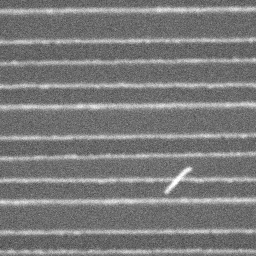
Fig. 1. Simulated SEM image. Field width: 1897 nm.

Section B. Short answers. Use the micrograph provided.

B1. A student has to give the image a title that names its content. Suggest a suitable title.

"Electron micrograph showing lines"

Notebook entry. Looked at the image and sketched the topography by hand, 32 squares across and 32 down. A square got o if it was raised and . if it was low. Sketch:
................................
oooooooooooooooooooooooooooooooo
oooooooooooooooooooooooooooooooo
oooooooooooooooooooooooooooooooo
oooooooooooooooooooooooooooooooo
................................
................................
..........................o..o.o
oooooooooooooooooooooooooooooooo
oooooooooooooooooooooooooooooooo
oooooooooooooooooooooooooooooooo
................................
................................
oooooooooooooooooooooooooooooooo
oooooooooooooooooooooooooooooooo
oooooooooooooooooooooooooooooooo
oooooooooooooooooooooooooooooooo
................................
................................
.............o.o.ooooooooooooooo
oooooooooooooooooooooooooooooooo
oooooooooooooooooooooooooooooooo
oooooooooooooo.oo..oooo..o..o...
................................
................................
oooooooooooooooooooooooooooooooo
oooooooooooooooooooooooooooooooo
oooooooooooooooooooooooooooooooo
oooooooooooooooooooooooooooooooo
................................
................................
.o.oo.oooo.ooooooooooooooooooooo